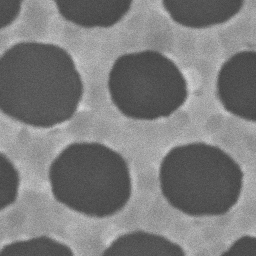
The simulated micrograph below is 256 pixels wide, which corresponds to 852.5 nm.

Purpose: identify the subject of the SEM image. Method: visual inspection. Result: holes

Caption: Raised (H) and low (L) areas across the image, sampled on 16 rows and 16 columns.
LHHHLLLLHHLLLLLH
LHHHHLLHHHHLLLHH
HHHHHHHHHHHHHHHH
LLLLHHHHLLHHHHHL
LLLLLHHLLLLHHHLL
LLLLLHHLLLLLHHLL
LLLLLHHLLLLHHHLL
HLLLHHHHHHHHHHHH
HHHHHHHHHHHHHHHH
HHHHLLLHHHHLLLHH
LHHLLLLLHHLLLLLH
LHHLLLLLHHLLLLLH
LHHHLLLLHHLLLLLH
HHHHHHLHHHHHHHHH
HHHHHHHHLHHHHHHH
LLLLHHHLLLLHHHLL